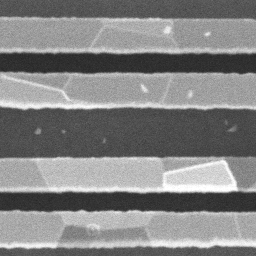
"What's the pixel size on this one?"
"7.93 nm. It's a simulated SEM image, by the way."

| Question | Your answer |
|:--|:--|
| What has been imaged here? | lines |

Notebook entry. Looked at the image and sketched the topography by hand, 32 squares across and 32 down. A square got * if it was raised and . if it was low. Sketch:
................................
................................
********************************
********************************
********************************
********************************
.*..**************.*************
................................
................................
********************************
********************************
********************************
********************************
...**...****.........*.****.****
................................
................................
................................
................................
................................
................................
********************************
********************************
********************************
********************************
................................
................................
*********************...**......
********************************
********************************
********************************
********************************
................................